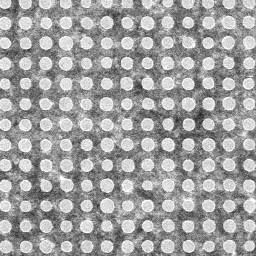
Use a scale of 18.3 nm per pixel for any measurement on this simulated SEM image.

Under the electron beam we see a regular array of raised bodies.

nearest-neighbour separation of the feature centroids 367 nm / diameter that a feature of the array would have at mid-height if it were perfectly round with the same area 217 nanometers